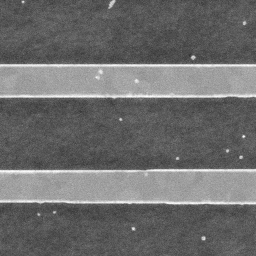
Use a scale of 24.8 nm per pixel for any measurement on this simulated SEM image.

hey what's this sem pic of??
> lines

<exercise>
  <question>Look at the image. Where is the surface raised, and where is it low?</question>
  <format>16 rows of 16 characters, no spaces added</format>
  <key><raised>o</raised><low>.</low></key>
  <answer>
................
................
................
................
oooooooooooooooo
oooooooooooooooo
................
................
................
................
................
oooooooooooooooo
oooooooooooooooo
................
................
................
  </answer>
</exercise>